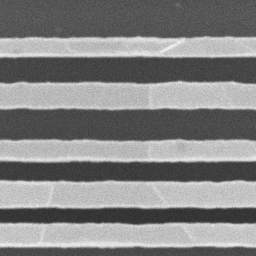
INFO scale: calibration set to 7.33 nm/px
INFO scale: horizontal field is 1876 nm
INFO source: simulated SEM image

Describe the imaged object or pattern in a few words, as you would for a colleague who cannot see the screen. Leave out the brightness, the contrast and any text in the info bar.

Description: lines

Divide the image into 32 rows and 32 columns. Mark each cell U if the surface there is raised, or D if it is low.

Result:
DDDDDDDDDDDDDDDDDDDDDDDDDDDDDDDD
DDDDDDDDDDDDDDDDDDDDDDDDDDDDDDDD
DDDDDDDDDDDDDDDDDDDDDDDDDDDDDDDD
DDDDDDDDDDDDDDDDDDDDDDDDDDDDDDDD
DDDDDDDDDDDDDDDDDDDDDDDDDDDDDDDD
UUUUUUUUUUUUUUUUUUUUUUUUUUUUUUUU
UUUUUUUUUUUUUUUUUUUUUUUUUUUUUUUU
DDDDDDDDDDDDDDDDDDDDDDDDDDDDDDDD
DDDDDDDDDDDDDDDDDDDDDDDDDDDDDDDD
DDDDDDDDDDDDDDDDDDDDDDDDDDDDDDDD
UUUUUUUUUUUUUUUUUDDUUUUUUUUUUUUD
UUUUUUUUUUUUUUUUUUUUUUUUUUUUUUUU
UUUUUUUUUUUUUUUUUUUUUUUUUUUUUUUU
UUDUUUUDDDUUUUUUUUUUDDUUUDDDUUUU
DDDDDDDDDDDDDDDDDDDDDDDDDDDDDDDD
DDDDDDDDDDDDDDDDDDDDDDDDDDDDDDDD
DDDDDDDDDDDDDDDDDDDDDDDDDDDDDDDD
DDDDDDUDDDDDDDDDDDDDDDUDDDDDDDDD
UUUUUUUUUUUUUUUUUUUUUUUUUUUUUUUU
UUUUUUUUUUUUUUUUUUUUUUUUUUUUUUUU
DDDDDDDDDDDDDDDDDDDDDDDDDDDDDDDD
DDDDDDDDDDDDDDDDDDDDDDDDDDDDDDDD
DDDDDDDDDDDDDDDDDDDDDDDDDDDDDDDD
UUUUUUUUUUUUUUUUUUUUUUUUUUUUUUUU
UUUUUUUUUUUUUUUUUUUUUUUUUUUUUUUU
UUUUUUUUUUUUUUUUUUUUUUUUUUUUUUUU
DDDDDDDDDDDDDDDDDDDDDDDDDDDDDDDD
DDDDDDDDDDDDDDDDDDDDDDDDDDDDDDDD
UUUUUUUUUUUUUUUUUUUUUUUUUUUUUUUU
UUUUUUUUUUUUUUUUUUUUUUUUUUUUUUUU
UUUUUUUUUUUUUUUUUUUUUUUUUUUUUUUU
DDDDDDDDDDDDDDDDDDDDDDDDDDDDDDDD